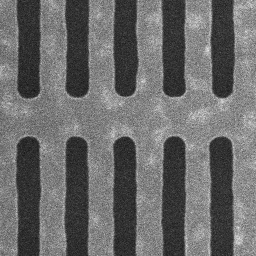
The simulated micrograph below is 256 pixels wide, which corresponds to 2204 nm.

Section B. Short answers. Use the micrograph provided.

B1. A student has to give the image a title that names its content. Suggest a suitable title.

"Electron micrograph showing holes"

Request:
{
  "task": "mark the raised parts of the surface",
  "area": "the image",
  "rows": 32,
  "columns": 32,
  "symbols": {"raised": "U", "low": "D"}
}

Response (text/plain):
UUDDDUUUDDDUUUDDDUUUDDDUUUDDDUUU
UUDDDUUUDDDUUUDDDUUUDDDUUUDDDUUU
UUDDDUUUDDDUUUDDDUUUDDDUUUDDDUUU
UUDDDUUUDDDUUUDDDUUUDDDUUUDDDUUU
UUDDDUUUDDDUUUDDDUUUDDDUUUDDDUUU
UUDDDUUUDDDUUUDDDUUUDDDUUUDDDUUU
UUDDDUUUDDDUUUDDDUUUDDDUUUDDDUUU
UUDDDUUUDDDUUUDDDUUUDDDUUUDDDUUU
UUDDDUUUDDDUUUDDDUUUDDDUUUDDDUUU
UUDDDUUUDDDUUUDDDUUUDDDUUUDDDUUU
UUDDDUUUDDDUUUDDDUUUDDDUUUDDDUUU
UUDDDUUUDDDUUUUDDUUUUDDUUUUDDUUU
UUUUUUUUUUUUUUUUUUUUUUUUUUUUUUUU
UUUUUUUUUUUUUUUUUUUUUUUUUUUUUUUU
UUUUUUUUUUUUUUUUUUUUUUUUUUUUUUUU
UUUUUUUUUUUUUUUUUUUUUUUUUUUUUUUU
UUUUUUUUUUUUUUUUUUUUUUUUUUUUUUUU
UUUDDUUUDDDUUUUDDUUUUDDUUUUDDUUU
UUDDDUUUDDDUUUDDDUUUDDDUUUDDDUUU
UUDDDUUUDDDUUUDDDUUUDDDUUUDDDUUU
UUDDDUUUDDDUUUDDDUUUDDDUUUDDDUUU
UUDDDUUUDDDUUUDDDUUUDDDUUUDDDUUU
UUDDDUUUDDDUUUDDDUUUDDDUUUDDDUUU
UUDDDUUUDDDUUUDDDUUUDDDUUUDDDUUU
UUDDDUUUDDDUUUDDDUUUDDDUUUDDDUUU
UUDDDUUUDDDUUUDDDUUUDDDUUUDDDUUU
UUDDDUUUDDDUUUDDDUUUDDDUUUDDDUUU
UUDDDUUUDDDUUUDDDUUUDDDUUUDDDUUU
UUDDDUUUDDDUUUDDDUUUDDDUUUDDDUUU
UUDDDUUUDDDUUUDDDUUUDDDUUUDDDUUU
UUDDDUUUDDDUUUDDDUUUDDDUUUDDDUUU
UUDDDUUUDDDUUUDDDUUUDDDUUUDDDUUU